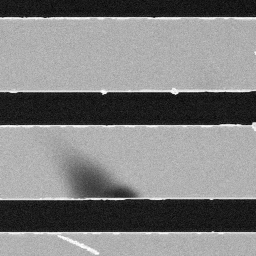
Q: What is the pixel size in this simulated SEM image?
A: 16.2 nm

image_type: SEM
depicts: lines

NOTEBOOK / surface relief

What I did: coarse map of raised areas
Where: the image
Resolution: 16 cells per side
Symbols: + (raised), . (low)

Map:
................
++++++++++++++++
++++++++++++++++
++++++++++++++++
++++++++++++++++
++++++++++++++++
................
................
++++++++++++++++
++++++++++++++++
++++++++++++++++
++++++++++++++++
................
................
................
++++++++++++++++